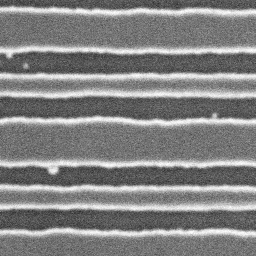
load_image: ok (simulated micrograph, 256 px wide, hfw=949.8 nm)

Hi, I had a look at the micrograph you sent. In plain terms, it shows lines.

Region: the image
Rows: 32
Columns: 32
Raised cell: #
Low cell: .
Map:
................................
################################
################################
################################
################################
################################
##..........##############.###.#
................................
................................
#############.##################
################################
################################
................................
................................
................................
################################
################################
################################
################################
################################
################################
................................
................................
################################
################################
################################
................................
................................
................................
################################
################################
################################